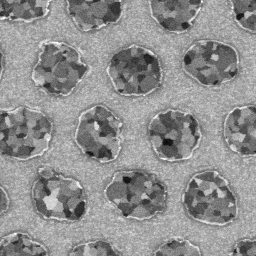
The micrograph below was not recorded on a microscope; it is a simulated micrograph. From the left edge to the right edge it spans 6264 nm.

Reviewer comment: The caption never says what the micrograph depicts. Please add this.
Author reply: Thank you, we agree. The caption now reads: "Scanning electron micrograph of a regular array of raised bodies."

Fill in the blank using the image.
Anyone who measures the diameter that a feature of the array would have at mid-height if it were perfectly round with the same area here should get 1250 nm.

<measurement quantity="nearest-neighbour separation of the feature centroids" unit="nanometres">1790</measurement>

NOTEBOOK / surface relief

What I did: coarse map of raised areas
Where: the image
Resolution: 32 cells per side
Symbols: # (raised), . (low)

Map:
######...######....######....###
######...######....######....###
...#.....######.....####......##
..........##........####......##
................................
......##................####....
.....#####.....####....#######..
.....#####....######...#######..
....#######...######...#######..
....######....######....#####...
.....#####....######.....##.....
......###......####.............
................................
..#.........#.................##
######....####......####....####
######....#####....######...####
######....#####....######...####
######...######....######...####
######....#####....#####.....###
.###.......####.....####......#.
................................
.....##.........#........##.....
.....####.....#####.....####....
....######...########..######...
#...######...########..######...
#...#######...######...#######..
.....######....#####....######..
.........................####...
................................
.###............................
#####......###.......###......##
######...######.....#####....###